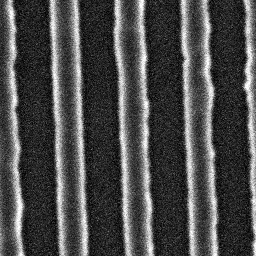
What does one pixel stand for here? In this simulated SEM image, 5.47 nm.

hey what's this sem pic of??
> one or a few lines or trenches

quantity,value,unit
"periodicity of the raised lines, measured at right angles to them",356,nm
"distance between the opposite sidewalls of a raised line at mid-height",137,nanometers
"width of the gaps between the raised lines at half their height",216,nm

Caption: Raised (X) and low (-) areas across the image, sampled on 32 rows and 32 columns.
X-----XXXX-----XXX-----XXX-----X
XX----XXXX-----XXX-----XXX-----X
XX-----XXX-----XXX-----XXX-----X
XX-----XXX-----XXX-----XXX-----X
XX-----XXX----XXXX-----XXX-----X
XX-----XXX----XXXX-----XXX-----X
XX-----XXX-----XXX-----XXX-----X
XX-----XXX-----XXX-----XXX-----X
XX-----XXX-----XXX-----XXX-----X
XX-----XXX-----XXX-----XXX-----X
XX-----XXX-----XXX-----XXX-----X
XX-----XXX-----XXX-----XXXX----X
XX-----XXX-----XXX-----XXXX----X
XX-----XXX-----XXX-----XXX-----X
XX-----XXX-----XXX-----XXX-----X
XX-----XXX-----XXX-----XXX-----X
XX-----XXX-----XXX-----XXX-----X
XX-----XXX-----XXX-----XXX-----X
XX-----XXX-----XXX-----XXX-----X
XX-----XXX-----XXX-----XXXX-----
XX-----XXX-----XXXX-----XXX----X
XX-----XXX------XX------XXX----X
XX-----XXX-----XXXX-----XXX----X
XX-----XXX------XXX-----XXX----X
XXX----XXX------XXX-----XXX-----
XXX----XXXX-----XXX-----XXX-----
XX-----XXXX-----XXX-----XXX-----
XX-----XXXX-----XXX-----XXX-----
XX------XXX-----XXX-----XXX-----
XXX-----XXX-----XXX-----XXX-----
XXX-----XXX-----XXX-----XXX-----
XXX-----XXX-----XXX-----XXX-----